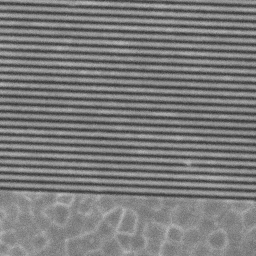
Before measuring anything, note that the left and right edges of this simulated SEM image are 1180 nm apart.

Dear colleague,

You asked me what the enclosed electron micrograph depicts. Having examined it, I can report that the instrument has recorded parallel lines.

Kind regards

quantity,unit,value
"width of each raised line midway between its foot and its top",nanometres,21.3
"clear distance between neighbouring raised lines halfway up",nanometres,16.7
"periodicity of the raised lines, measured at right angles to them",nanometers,35.5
